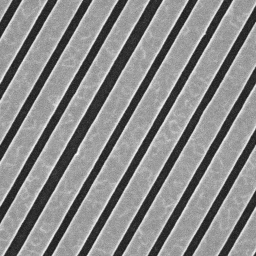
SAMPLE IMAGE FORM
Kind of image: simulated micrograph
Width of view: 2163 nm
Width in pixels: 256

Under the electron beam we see parallel lines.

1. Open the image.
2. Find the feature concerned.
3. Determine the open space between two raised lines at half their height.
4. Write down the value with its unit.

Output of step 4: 77 nanometers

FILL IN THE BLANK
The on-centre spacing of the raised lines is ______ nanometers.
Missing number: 258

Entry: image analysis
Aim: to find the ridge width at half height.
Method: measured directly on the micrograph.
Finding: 184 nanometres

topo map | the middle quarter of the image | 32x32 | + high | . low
++++...+++++...+++++++..++++++..
+++...+++++....++++++...++++++..
+++...+++++...++++++...++++++...
++...+++++....++++++..+++++++..+
++..++++++...++++++...++++++...+
+...+++++....++++++..++++++...++
+..+++++....++++++...++++++...++
...+++++...+++++++..++++++...+++
..+++++....++++++...++++++..++++
..+++++...++++++...++++++...++++
.+++++....++++++..+++++++..+++++
++++++...++++++...++++++...+++++
+++++....++++++..++++++...++++++
++++....++++++...++++++...++++++
++++...+++++++..++++++...++++++.
+++....++++++...++++++..+++++++.
+++...++++++...++++++...++++++..
++....++++++..+++++++..++++++...
++...++++++...++++++...++++++..+
+....++++++..++++++...++++++...+
....++++++...++++++...++++++..++
...+++++++..++++++...++++++...++
...++++++...++++++..+++++++..+++
..++++++...++++++...++++++...+++
..++++++..+++++++..++++++...++++
.++++++...++++++...++++++..+++++
.++++++..+++++++..++++++...+++++
++++++...++++++...++++++..++++++
++++++..++++++...++++++...++++++
+++++...++++++..+++++++..++++++.
++++...++++++...++++++...++++++.
++++..+++++++..++++++...++++++..